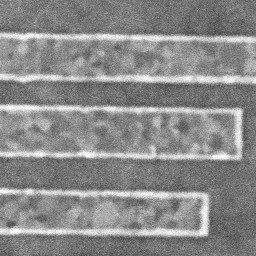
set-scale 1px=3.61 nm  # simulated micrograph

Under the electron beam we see one or a few lines or trenches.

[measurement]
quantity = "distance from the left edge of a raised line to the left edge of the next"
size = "277 nm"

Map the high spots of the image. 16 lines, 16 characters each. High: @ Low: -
----------------
----------------
@@@@@@@@@@@@@@@@
@@@@@@@@@@@@@@@@
@@@@@@@@@@@@@@@@
----------------
----------------
@@@@@@@@@@@@@@@-
@@@@@@@@@@@@@@@-
@@@@@@@@@@@@@@@-
----------------
----------------
@@@@@@@@@@@@@---
@@@@@@@@@@@@@---
--@--@@@@@@@@---
----------------